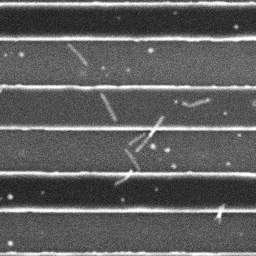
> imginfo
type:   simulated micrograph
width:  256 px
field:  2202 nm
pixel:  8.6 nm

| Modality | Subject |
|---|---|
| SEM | lines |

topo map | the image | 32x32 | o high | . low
oooooooooooooooooooooooooooooooo
oooooooooooooooooooooooooooooooo
oooooooooooooooooooooooooooooooo
oooooooooooooooooooooooooooooooo
oooooooooooooooooooooooooooooooo
................................
................................
................................
................................
................................
................................
oooooooooooooooooooooooooooooooo
oooooooooooooooooooooooooooooooo
oooooooooooooooooooooooooooooooo
oooooooooooooooooooooooooooooooo
oooooooooooooooooooooooooooooooo
................................
................................
................................
................................
................................
................................
oooooooooooooooooooooooooooooooo
oooooooooooooooooooooooooooooooo
oooooooooooooooooooooooooooooooo
oooooooooooooooooooooooooooooooo
...........................o....
................................
................................
................................
................................
................................